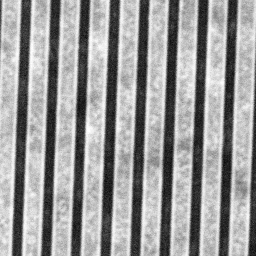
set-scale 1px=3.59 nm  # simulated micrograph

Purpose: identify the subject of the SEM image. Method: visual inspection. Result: parallel lines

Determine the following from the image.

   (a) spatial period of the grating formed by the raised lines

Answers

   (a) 0.106 um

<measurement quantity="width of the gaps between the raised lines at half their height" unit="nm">46.6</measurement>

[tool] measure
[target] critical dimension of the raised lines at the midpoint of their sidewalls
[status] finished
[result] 0.0592 microns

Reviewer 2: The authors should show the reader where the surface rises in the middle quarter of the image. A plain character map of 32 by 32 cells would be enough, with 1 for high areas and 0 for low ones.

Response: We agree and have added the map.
11100011110000111100011110000111
11100011110000111100011110000111
11100011110000111100011110001111
11100011110000111100011110001111
11100011110000111100011110001111
11100011110000111100011110001111
11100011110000111100011110001111
11100011110000111100011110001111
11100011110001111100011110001111
11100011110001111100011110001111
11100011110001111100011110001111
11100011110001111100011110001111
11000011110001111000011110001111
11000011110001111000011110001111
11000011110001111000011110001111
11000011110001111000011110001111
11000011110001111000011110001111
11000011110001111000011110001111
11000011110001111000011110001111
11000011110001111000111100001111
11000011110001111000111100001111
11000011110001111000111100001111
11000011100001111000111100001111
11000011100001111000111100001111
11000011100001111000111100001111
11000111100001111000111100001111
11000111100001111000111100001111
11000111100001111000111100001111
11000111100001111000111100001111
11000111100001111000111100011111
11000111100001111000111100011111
11000111100001111000111100011111